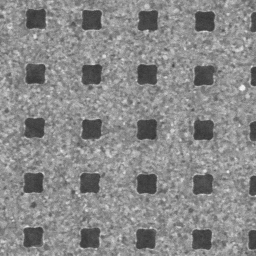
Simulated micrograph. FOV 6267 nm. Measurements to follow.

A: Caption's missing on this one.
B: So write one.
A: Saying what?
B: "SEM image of a regular array of holes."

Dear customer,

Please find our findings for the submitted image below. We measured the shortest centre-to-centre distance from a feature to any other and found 1330 nm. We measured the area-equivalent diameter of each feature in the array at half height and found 0.561 micrometres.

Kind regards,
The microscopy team